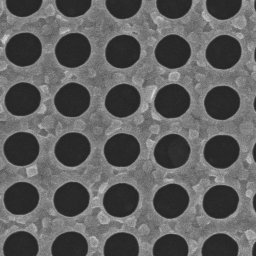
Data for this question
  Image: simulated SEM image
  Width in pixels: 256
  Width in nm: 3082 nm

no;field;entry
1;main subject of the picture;a regular array of holes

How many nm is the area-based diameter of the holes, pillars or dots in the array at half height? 425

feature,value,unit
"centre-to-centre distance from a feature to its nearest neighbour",595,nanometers